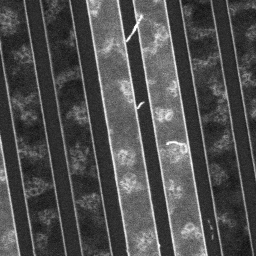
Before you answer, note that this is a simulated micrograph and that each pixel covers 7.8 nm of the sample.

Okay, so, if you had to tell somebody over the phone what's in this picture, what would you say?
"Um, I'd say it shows parallel lines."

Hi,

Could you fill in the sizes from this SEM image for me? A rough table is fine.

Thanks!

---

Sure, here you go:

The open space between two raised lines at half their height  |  115 nm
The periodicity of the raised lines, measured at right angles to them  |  361 nm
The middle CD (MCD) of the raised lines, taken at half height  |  244 nm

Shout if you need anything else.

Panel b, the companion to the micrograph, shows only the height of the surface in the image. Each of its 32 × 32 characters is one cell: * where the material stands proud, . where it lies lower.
***..****..****..****..***..****
***..****..****..****..****..***
***..****..****..****..****..***
****..***..****..****..****..***
****..***...***..****..****..***
****..****..****..***..****..***
****..****..****..****..****.***
****..****..****..****..****..**
****..****..****..****..****..**
.****..***..****..****..****..**
.****..***...***..****..****..**
.****..****..****..***..****..**
.****..****..****..****..****.**
.****..****..****..****..****..*
.****..****..****..****..****..*
..****..***..****..****..****..*
..****..***...***..****..****..*
..****..****..****..***..****..*
..****..****..****..****..****.*
..****..****..****..****..****..
*.****..****..****..****..****..
*..****..***..****..****..****..
*..****..***...***..****..****..
*..****..****..****.****..****..
*..****..****..****..****..***..
*..****..****..****..****..****.
**.****..****..****..****..****.
**..****..***..****..****..****.
**..****..***...***..****..****.
**..****..****..****.****..****.
**..****..****..****..****..***.
**..****..****..****..****..****